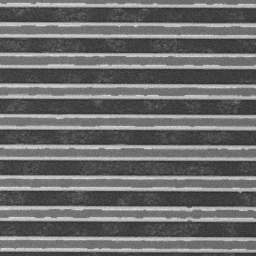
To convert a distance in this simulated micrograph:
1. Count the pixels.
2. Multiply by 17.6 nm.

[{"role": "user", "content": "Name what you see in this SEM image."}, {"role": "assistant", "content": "parallel lines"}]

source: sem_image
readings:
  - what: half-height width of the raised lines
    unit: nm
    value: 209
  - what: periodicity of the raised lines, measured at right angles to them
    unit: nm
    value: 539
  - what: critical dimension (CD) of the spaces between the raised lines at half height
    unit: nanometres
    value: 337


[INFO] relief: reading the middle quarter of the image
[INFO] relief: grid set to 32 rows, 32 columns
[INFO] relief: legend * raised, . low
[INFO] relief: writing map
...*****************************
................................
................................
................................
................................
................................
********************************
********************************
................................
................................
................................
................................
................................
********************************
********************************
********************************
................................
................................
................................
................................
................................
********************************
********************************
********************************
................................
................................
................................
................................
****************************....
********************************
********************************
................................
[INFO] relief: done